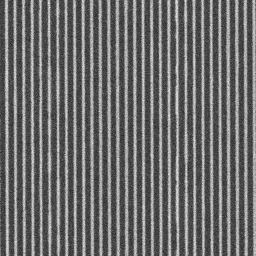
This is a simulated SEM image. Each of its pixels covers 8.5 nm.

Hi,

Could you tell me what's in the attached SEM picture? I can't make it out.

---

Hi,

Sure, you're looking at parallel lines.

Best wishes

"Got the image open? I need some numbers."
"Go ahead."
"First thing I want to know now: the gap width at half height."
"48.9 nm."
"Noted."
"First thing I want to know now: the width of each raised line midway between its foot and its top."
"23.4 nanometers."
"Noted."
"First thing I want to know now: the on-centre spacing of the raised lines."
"8.53 px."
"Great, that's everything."